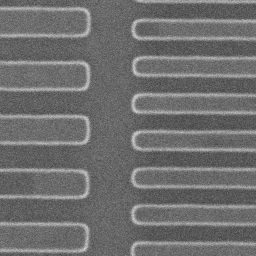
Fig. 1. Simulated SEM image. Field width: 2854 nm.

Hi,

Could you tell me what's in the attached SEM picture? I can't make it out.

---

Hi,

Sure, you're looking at groups of lines, slits or small figures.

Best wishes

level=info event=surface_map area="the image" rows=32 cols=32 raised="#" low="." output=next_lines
................................
###########.....................
###########.....................
###########......###############
.................###############
................................
................................
.................###############
###########......###############
###########.....................
###########.....................
................................
.................###############
.................###############
................................
###########.....................
###########......###############
###########......###############
.................###############
................................
................................
##########.......###############
###########......###############
###########.....................
##########......................
................................
.................###############
.................###############
###########.....................
###########.....................
###########......###############
.................###############